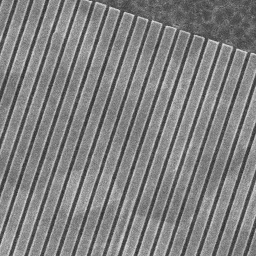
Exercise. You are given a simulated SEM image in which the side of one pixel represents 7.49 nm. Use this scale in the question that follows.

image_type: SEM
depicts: parallel lines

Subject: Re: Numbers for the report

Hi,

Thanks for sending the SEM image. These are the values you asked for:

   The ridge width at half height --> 79.1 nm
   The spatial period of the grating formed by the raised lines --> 111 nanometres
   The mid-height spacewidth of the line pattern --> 0.0294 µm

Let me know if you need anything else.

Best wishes